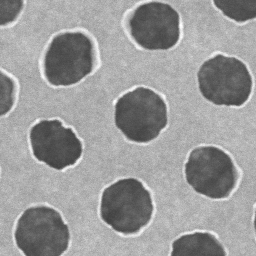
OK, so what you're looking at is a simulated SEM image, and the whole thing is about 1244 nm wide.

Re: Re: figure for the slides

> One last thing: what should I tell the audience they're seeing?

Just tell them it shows holes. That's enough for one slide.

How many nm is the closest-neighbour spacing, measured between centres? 430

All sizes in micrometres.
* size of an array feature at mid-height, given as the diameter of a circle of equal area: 0.253